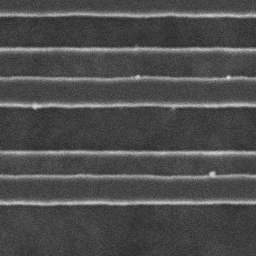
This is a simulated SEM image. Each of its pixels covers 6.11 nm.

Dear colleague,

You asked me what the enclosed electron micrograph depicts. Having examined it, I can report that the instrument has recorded lines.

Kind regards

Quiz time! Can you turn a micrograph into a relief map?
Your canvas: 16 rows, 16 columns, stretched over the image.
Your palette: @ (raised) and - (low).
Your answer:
@@@@@@@@@@@@@@@@
----------------
----------------
@@@@@@@@@@@@@@@@
@@@@@@@@@@@@@@@@
@@@@@@@@@@@@@@@@
@@@@@@@@@@@@@@@@
----------------
----------------
----------------
@@@@@@@@@@@@@@@@
@@@@@@@@@@@@@@@@
@@@@@@@@@@@@@@@@
----------------
----------------
----------------